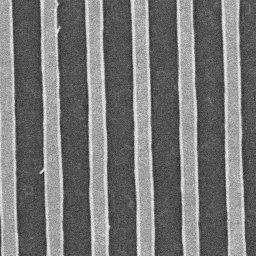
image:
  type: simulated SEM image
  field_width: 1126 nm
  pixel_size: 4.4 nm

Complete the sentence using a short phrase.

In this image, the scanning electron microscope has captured parallel lines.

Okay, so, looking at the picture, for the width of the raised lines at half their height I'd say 62.7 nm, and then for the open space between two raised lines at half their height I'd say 137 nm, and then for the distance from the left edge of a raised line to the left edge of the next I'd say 200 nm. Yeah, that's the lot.